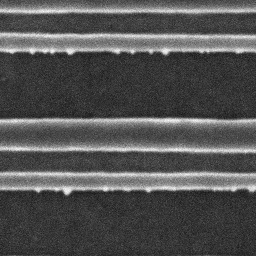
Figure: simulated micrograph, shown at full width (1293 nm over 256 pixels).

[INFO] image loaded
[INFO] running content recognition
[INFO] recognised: lines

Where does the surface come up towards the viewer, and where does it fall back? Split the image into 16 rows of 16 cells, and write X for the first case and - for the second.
XXXXXXXXXXXXXXXX
XXXXXXXXXXXXXXXX
XXXXXXXXXXXXXXXX
----------------
----------------
----------------
----------------
--XX------------
XXXXXXXXXXXXXXXX
XXXXXXXXXXXXXXXX
XXXXXXXXXXXXXXXX
XXXXXXXXXXXXXXXX
----------------
----------------
----------------
----------------